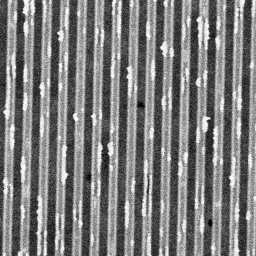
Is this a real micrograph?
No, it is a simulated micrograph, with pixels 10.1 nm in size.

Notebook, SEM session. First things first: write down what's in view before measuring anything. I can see parallel lines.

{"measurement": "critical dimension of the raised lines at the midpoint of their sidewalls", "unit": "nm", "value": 80.6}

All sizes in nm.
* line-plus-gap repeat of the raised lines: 176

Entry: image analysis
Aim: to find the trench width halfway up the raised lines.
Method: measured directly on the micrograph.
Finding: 98.3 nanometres